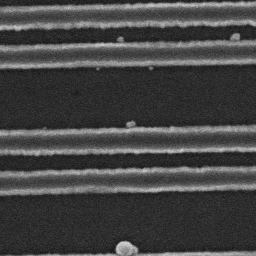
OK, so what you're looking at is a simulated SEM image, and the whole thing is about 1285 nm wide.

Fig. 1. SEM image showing lines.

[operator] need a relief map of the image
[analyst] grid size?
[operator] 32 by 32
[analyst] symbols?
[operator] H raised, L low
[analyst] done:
LLLLLLLLLLLLLLLLLLLLHLHLHHHHHHHH
HHHHHHHHHHHHHHHHHHHHHHHHHHHHHHHH
HHHHHHHHHHHHHHHHHHHHHHHHHHHHHHHH
HLHLLLLLLLLLLLLLLLLLLLLLLLLLLLLL
LLLLLLLLLLLLLLLLLLLLLLLLLLLLLLLL
LLLLLLLLLLLLHHHHHHHHHHHHHHHHHHHH
HHHHHHHHHHHHHHHHHHHHHHHHHHHHHHHH
HHHHHHHHHHHHHHHHHHHHHHHHHHHHHHHH
LLLLLLLLLLLLLLLLLLLLLLLLLLLLLLLL
LLLLLLLLLLLLLLLLLLLLLLLLLLLLLLLL
LLLLLLLLLLLLLLLLLLLLLLLLLLLLLLLL
LLLLLLLLLLLLLLLLLLLLLLLLLLLLLLLL
LLLLLLLLLLLLLLLLLLLLLLLLLLLLLLLL
LLLLLLLLLLLLLLLLLLLLLLLLLLLLLLLL
LLLLLLLLLLLLLLLLLLLLLLLLLLLLLLLL
LLLLLLLLLLLLLLLLLLLLLLLLLLLLLLLL
LHHLHHHHHHHHHHHHHHHHHHHHHHHHHHHH
HHHHHHHHHHHHHHHHHHHHHHHHHHHHHHHH
HHHHHHHHHHHHHHHHHHHHHHHHHHHHHHHH
LLLLLLLLLLLLLLLLLLLLLLLLLLLLLLLL
LLLLLLLLLLLLLLLLLLLLLLLLLLLLLLLL
LLLLLHHLHHHHHHHHHHHHHHHHHHHHHHHH
HHHHHHHHHHHHHHHHHHHHHHHHHHHHHHHH
HHHHHHHHHHHHHHHHHHHHHHHHHHHHHHHH
LLLLLLLLLLLLLLLLLLLLLLLLLLLLLLLL
LLLLLLLLLLLLLLLLLLLLLLLLLLLLLLLL
LLLLLLLLLLLLLLLLLLLLLLLLLLLLLLLL
LLLLLLLLLLLLLLLLLLLLLLLLLLLLLLLL
LLLLLLLLLLLLLLLLLLLLLLLLLLLLLLLL
LLLLLLLLLLLLLLLLLLLLLLLLLLLLLLLL
LLLLLLLLLLLLLLLHLLLLLLLLLLLLLLLL
LLLLLLLLLLLLLLHHHLLLLLLLLLLLLLLL